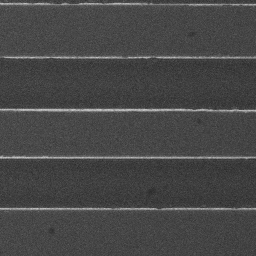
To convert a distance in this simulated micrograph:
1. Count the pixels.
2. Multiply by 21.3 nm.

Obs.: lines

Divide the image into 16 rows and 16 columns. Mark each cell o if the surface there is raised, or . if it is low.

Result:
oooooooooooooooo
oooooooooooooooo
oooooooooooooooo
oooooooooooooooo
................
................
................
oooooooooooooooo
oooooooooooooooo
oooooooooooooooo
................
................
................
oooooooooooooooo
oooooooooooooooo
oooooooooooooooo